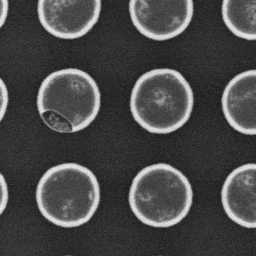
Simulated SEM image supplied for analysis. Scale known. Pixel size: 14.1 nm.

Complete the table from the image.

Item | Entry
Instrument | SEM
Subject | raised bodies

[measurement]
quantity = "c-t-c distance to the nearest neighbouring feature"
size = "92 px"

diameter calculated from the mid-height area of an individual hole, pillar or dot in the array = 832 nanometers